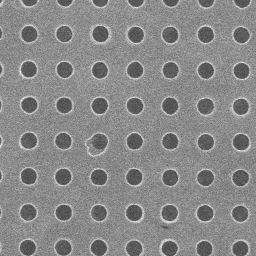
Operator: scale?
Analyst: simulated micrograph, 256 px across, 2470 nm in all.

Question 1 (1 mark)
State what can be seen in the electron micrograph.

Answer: a regular array of holes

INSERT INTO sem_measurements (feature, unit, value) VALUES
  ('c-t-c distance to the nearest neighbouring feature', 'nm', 339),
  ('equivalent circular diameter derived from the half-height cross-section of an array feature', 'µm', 0.16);